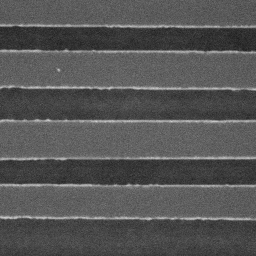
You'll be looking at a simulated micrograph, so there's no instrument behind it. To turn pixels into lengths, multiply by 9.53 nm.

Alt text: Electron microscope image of lines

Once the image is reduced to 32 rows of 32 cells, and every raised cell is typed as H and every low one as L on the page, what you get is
HHHHHHHHHHHHHHHHHHHHHHHHHHHHHHHH
HHHHHHHHHHHHHHHHHHHHHHHHHHHHHHHH
HHHHHHHHHHHHHHHHHHHHHHHHHHHHHHHH
LLLLLLLLLLLLLLLLLLLLLLLLLLLLLLLL
LLLLLLLLLLLLLLLLLLLLLLLLLLLLLLLL
LLLLLLLLLLLLLLLLLLLLLLLLLLLLLLLL
HHHHHHHHHHHHHHHHHHHHHHHHHHHHHHLL
HHHHHHHHHHHHHHHHHHHHHHHHHHHHHHHH
HHHHHHHHHHHHHHHHHHHHHHHHHHHHHHHH
HHHHHHHHHHHHHHHHHHHHHHHHHHHHHHHH
HHHHHHHHHHHHHHHHHHHHHHHHHHHHHHHH
LLLLLLLLLLLLLLLLLLLLLLLLLLLLLLLL
LLLLLLLLLLLLLLLLLLLLLLLLLLLLLLLL
LLLLLLLLLLLLLLLLLLLLLLLLLLLLLLLL
LLLLLLLLLLLLLLLLLLLLLLLLLLLLLLLL
HHHHHHHHHHHHHHHHHHHHHHHHHHHHHHHH
HHHHHHHHHHHHHHHHHHHHHHHHHHHHHHHH
HHHHHHHHHHHHHHHHHHHHHHHHHHHHHHHH
HHHHHHHHHHHHHHHHHHHHHHHHHHHHHHHH
HHHHHHHHHHHHHHHHHHHHHHHHHHHHHHHH
LLLLLLLLLLLLLLLLLLLLLLLLLLLLLLLL
LLLLLLLLLLLLLLLLLLLLLLLLLLLLLLLL
LLLLLLLLLLLLLLLLLLLLLLLLLLLLLLLL
HHHHHHHHHHHHHHHHHHHHHHHHHHHHHHHH
HHHHHHHHHHHHHHHHHHHHHHHHHHHHHHHH
HHHHHHHHHHHHHHHHHHHHHHHHHHHHHHHH
HHHHHHHHHHHHHHHHHHHHHHHHHHHHHHHH
LLLLLLLLLLLLLLLLLLLLLLLLLLLLLLLL
LLLLLLLLLLLLLLLLLLLLLLLLLLLLLLLL
LLLLLLLLLLLLLLLLLLLLLLLLLLLLLLLL
LLLLLLLLLLLLLLLLLLLLLLLLLLLLLLLL
LLLLLLLLLLLLLLLLLLLLLLLLLLLLLLLL